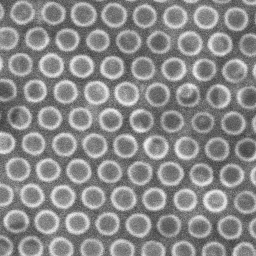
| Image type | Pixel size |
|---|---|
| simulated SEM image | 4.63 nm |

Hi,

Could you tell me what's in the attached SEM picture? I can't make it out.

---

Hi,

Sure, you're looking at a regular array of raised bodies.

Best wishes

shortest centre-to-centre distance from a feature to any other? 139 nm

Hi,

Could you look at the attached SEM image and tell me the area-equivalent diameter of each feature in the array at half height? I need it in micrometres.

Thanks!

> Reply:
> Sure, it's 0.101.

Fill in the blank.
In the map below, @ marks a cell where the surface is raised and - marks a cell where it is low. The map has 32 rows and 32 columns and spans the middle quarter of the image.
--@@@@@--@@@@@---@@@@@---@@@@@--
--@@@@@--@@@@@---@@@@@---@@@@@--
---@@@----@@@@---@@@@@---@@@@@--
------------------@@@-----@@@---
@-------------------------------
@@@---@@@@----@@@-----@@@-----@@
@@@--@@@@@@--@@@@@---@@@@@---@@@
@@@--@@@@@@--@@@@@---@@@@@--@@@@
@@----@@@@@--@@@@@---@@@@@--@@@@
@------@@-----@@@@---@@@@@---@@@
--------------------------------
---@@------@--------------------
--@@@@---@@@@@---@@@@@---@@@@---
--@@@@@--@@@@@---@@@@@---@@@@@--
--@@@@@--@@@@@---@@@@@---@@@@@--
--@@@@----@@@@---@@@@@---@@@@---
------------------@@@-----@@----
--------------------------------
@@----@@@@---@@@@-----@@@-----@-
@@@--@@@@@---@@@@@---@@@@---@@@@
@@@--@@@@@---@@@@@--@@@@@@--@@@@
@@@--@@@@@---@@@@@--@@@@@@--@@@@
@@----@@@@----@@@----@@@@----@@@
------------------------------@-
--@@@-----@@--------------------
-@@@@@---@@@@@---@@@@---@@@@@---
-@@@@@---@@@@@--@@@@@@--@@@@@---
-@@@@@---@@@@@--@@@@@@--@@@@@@--
--@@@@---@@@@@---@@@@---@@@@@---
-----------------@@@-----@@@----
--------------------------------
@@---@@@@----@@@@-----@@--------